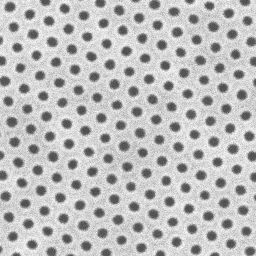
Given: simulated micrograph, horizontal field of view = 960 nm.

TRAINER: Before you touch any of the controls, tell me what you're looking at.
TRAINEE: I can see a regular array of holes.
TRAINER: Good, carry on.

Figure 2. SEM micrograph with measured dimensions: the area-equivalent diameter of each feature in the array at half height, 0.0388 micrometres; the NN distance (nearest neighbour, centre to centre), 75.7 nanometres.